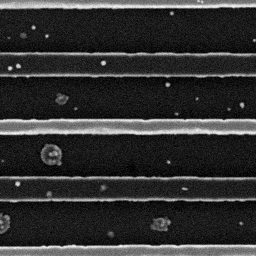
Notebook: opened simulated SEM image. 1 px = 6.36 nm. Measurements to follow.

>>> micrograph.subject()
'lines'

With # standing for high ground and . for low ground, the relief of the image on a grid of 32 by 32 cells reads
################################
................................
................................
................................
................................
................................
................................
################################
################################
............#...........##.#....
................................
................................
................................
................................
................................
################################
#####.#####..###################
................................
................................
......#.........................
................................
................................
################################
################################
################################
................................
................................
................................
................................
................................
................................
################################